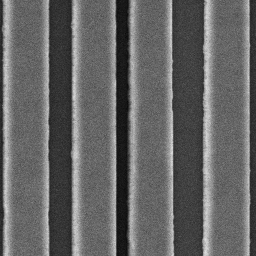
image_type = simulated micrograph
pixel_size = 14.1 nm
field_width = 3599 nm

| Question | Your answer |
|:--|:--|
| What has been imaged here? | lines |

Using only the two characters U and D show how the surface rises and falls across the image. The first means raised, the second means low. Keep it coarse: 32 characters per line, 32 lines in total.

DUUUUUDDDUUUUUDDUUUUUDDDDDUUUUUD
DUUUUUDDDUUUUUDDUUUUUDDDDDUUUUUD
DUUUUUDDDUUUUUDDUUUUUDDDDDUUUUUD
UUUUUUDDDUUUUUDDUUUUUDDDDDUUUUUD
DUUUUUDDDUUUUUDDUUUUUDDDDDUUUUUD
UUUUUUDDDUUUUUDDUUUUUDDDDDUUUUUD
DUUUUUDDDUUUUUDDUUUUUDDDDDUUUUUD
UUUUUUDDDUUUUUDDUUUUUDDDDDUUUUUD
DUUUUUDDDUUUUUDDUUUUUDDDDDUUUUUD
DUUUUUDDDUUUUUDDUUUUUDDDDDUUUUUD
DUUUUUDDDUUUUUDDUUUUUDDDDDUUUUUD
DUUUUUDDDUUUUUDDUUUUUDDDDDUUUUUD
DUUUUUDDDUUUUUDDUUUUUDDDDDUUUUUD
UUUUUUDDDUUUUUDDUUUUUDDDDDUUUUUD
DUUUUUDDDUUUUUDDUUUUUUDDDDUUUUUD
DUUUUUDDDUUUUUDDUUUUUUDDDDUUUUUD
UUUUUUDDDUUUUUDDUUUUUUDDDDUUUUUD
DUUUUUDDDUUUUUDDUUUUUUDDDDUUUUUD
DUUUUUDDDUUUUUDDUUUUUUDDDDUUUUUD
DUUUUUDDDUUUUUDDUUUUUUDDDDUUUUUD
DUUUUUDDDUUUUUDDUUUUUUDDDDUUUUUD
DUUUUUDDDUUUUUDDUUUUUUDDDDUUUUUD
DUUUUUDDDUUUUUDDUUUUUUDDDDUUUUUD
UUUUUUDDDUUUUUDDUUUUUUDDDDUUUUUD
UUUUUUDDDUUUUUDDUUUUUUDDDDUUUUUD
UUUUUUDDDUUUUUDDUUUUUUDDDDUUUUUD
DUUUUUDDDUUUUUDDUUUUUUDDDDUUUUUD
DUUUUUDDDUUUUUDDUUUUUUDDDDUUUUUD
DUUUUUDDDUUUUUDDUUUUUUDDDUUUUUUD
DUUUUUDDDUUUUUDDUUUUUUDDDUUUUUUD
DUUUUUDDDUUUUUDDUUUUUUDDDUUUUUUD
DUUUUUDDDUUUUUDDUUUUUUDDDUUUUUUD